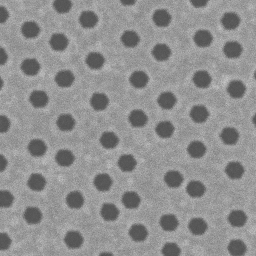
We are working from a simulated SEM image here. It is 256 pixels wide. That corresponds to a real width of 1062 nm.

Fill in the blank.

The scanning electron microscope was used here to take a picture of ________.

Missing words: a regular array of holes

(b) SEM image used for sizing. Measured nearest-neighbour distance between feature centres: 136 nm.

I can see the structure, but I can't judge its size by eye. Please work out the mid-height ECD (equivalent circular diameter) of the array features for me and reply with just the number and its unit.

77.9 nanometers